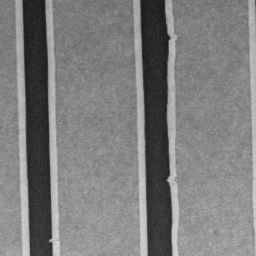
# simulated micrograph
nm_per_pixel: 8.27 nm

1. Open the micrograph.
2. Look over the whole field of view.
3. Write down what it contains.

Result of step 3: one or a few lines or trenches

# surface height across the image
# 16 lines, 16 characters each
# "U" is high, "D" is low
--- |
UDDUUUUUDDDUUUUU
UDDUUUUUUDDUUUUU
UDDUUUUUUDDUUUUU
UDDUUUUUUDDUUUUU
UDDUUUUUUDDUUUUU
UDDUUUUUUDDUUUUU
UDDUUUUUUDDUUUUU
UDDUUUUUUDDUUUUU
UDDUUUUUUDDUUUUU
UDDUUUUUUDDUUUUU
UDDUUUUUUDDUUUUU
UDDUUUUUUDDUUUUU
UDDUUUUUUDDUUUUU
UUDUUUUUUDDUUUUU
UUDUUUUUUDDUUUUU
UUDDUUUUUDDUUUUU